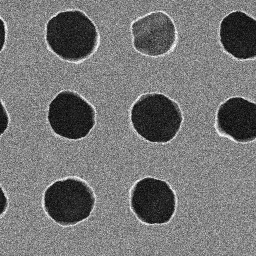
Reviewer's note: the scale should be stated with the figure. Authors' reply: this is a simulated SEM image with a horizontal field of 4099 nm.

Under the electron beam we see holes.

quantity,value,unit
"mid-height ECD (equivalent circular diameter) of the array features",754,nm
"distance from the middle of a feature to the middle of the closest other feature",1300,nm